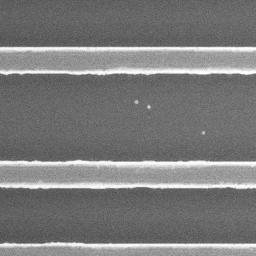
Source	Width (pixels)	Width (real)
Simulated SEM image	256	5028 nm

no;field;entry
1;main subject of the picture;lines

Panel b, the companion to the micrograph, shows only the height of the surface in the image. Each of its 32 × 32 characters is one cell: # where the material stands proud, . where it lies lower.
................................
................................
................................
................................
................................
................................
################################
################################
################################
................................
................................
................................
................................
................................
................................
................................
................................
................................
................................
................................
################################
################################
################################
................................
................................
................................
................................
................................
................................
................................
.......##.......................
################################